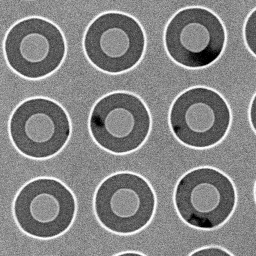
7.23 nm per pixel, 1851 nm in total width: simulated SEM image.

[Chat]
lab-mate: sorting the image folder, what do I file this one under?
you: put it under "an array of small figures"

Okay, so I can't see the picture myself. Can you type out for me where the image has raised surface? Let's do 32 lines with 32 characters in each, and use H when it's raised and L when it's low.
HHHHHHHHHHHHHHHHHHHHHHHHHHHHHHHH
HHHHHHHHHHHHHHHHHHHHHHLLLLHHHHHH
HHHLLLHHHHHHLLLLLHHHHLLLLLLHHHHL
HLLLLLLHHHHLLLLLLLHHHLLHHHLLHHHL
HLLLHLLLHHHLLHHHLLHHHLLHHHLLHHHL
HLLHHHLLHHHLLHHHLLHHHLLHHHLLHHHL
HLLHHHLLHHHLLHHHLLHHHLLLLLLLHHHH
HLLLHLLLHHHLLLLLLHHHHHLLLLLHHHHH
HHLLLLLHHHHHLLLLHHHHHHHHHHHHHHHH
HHHLLLHHHHHHHHHHHHHHHHHHHHHHHHHH
HHHHHHHHHHHHHHHHHHHHHHHHHHHHHHHH
HHHHHHHHHHHHHHHHHHHHHHHLLLLHHHHH
HHHHLLHHHHHHHLLLLLHHHHLLLLLLHHHH
HHLLLLLLHHHHLLLLLLHHHLLLHHLLLHHL
HHLLHHLLHHHLLHHHLLLHHLLHHHHLLHHL
HLLHHHHLLHHLLHHHHLLHHLLHHHHLLHHH
HLLHHHHLLHHLLLHHLLLHHHLLLLLLHHHH
HHLLHHLLHHHHLLLLLLHHHHHLLLLLHHHH
HHLLLLLLHHHHHLLLLHHHHHHHHHHHHHHH
HHHHLLHHHHHHHHHHHHHHHHHHHHHHHHHH
HHHHHHHHHHHHHHHHHHHHHHHHHHHHHHHH
HHHHHHHHHHHHHHHHHHHHHHHHLLLHHHHH
HHHHLLLHHHHHHLLLLLHHHHHLLLLLLHHH
HHHLLLLLHHHHLLLLLLLHHHLLHHHLLHHH
HHLLLHLLLHHHLLHHHLLHHHLLHHHLLHHH
HHLLHHHLLHHHLLHHHLLHHHLLHHHLLHHH
HHLLHHHLLHHHLLHHHLLHHHLLLLLLLHHH
HHLLLHLLLHHHLLLLLLLHHHHLLLLLHHHH
HHHLLLLLHHHHHLLLLLHHHHHHHLLHHHHH
HHHHLLLHHHHHHHHHHHHHHHHHHHHHHHHH
HHHHHHHHHHHHHHHHHHHHHHHHHHHHHHHH
HHHHHHHHHHHHHHHHHHHHHHHHLLLLHHHH